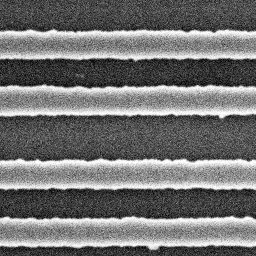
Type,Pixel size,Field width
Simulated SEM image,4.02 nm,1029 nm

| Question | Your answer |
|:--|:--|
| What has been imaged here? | lines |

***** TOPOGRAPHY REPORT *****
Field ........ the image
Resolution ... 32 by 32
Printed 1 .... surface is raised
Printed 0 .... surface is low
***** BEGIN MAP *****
00000000000000000000000000000000
00000000000000000000000000000000
00000000000000000000000000000000
00000000000000000000000000000000
11111111111111111111111111111111
11111111111111111111111111111111
11111111111111111111111111111111
00000000000000000000000000000000
00000000000000000000000000000000
00000000000000000000000000000000
00000000000000000000000000000000
11111111111111111111111111111111
11111111111111111111111111111111
11111111111111111111111111111111
00000000000000000000000000000000
00000000000000000000000000000000
00000000000000000000000000000000
00000000000000000000000000000000
00000000000000000000000000000000
00000000000000000000000000000000
11111111111111111111111111111111
11111111111111111111111111111111
11111111111111111111111111111111
11111111111111111111111101111111
00000000000000000000000000000000
00000000000000000000000000000000
00000000000000000000000000000000
11111111111111111110111111111111
11111111111111111111111111111111
11111111111111111111111111111111
11111111111111111111111111111111
00000000000000000000000000000000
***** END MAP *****